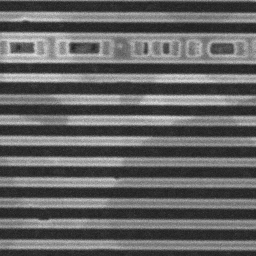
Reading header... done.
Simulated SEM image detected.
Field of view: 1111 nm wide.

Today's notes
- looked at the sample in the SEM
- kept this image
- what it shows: parallel lines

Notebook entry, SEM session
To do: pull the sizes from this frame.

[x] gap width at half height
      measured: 0.0569 µm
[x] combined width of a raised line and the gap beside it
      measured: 0.0897 um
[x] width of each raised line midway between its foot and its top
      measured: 32.5 nm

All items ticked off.